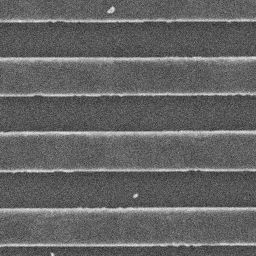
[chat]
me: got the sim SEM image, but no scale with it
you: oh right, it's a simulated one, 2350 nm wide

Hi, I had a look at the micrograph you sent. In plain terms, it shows lines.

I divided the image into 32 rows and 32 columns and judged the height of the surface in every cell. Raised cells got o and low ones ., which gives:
oooooooooooooooooooooooooooooooo
oooooooooooooooooooooooooooooooo
oooooooooooooooooooooooooooooooo
................................
................................
................................
................................
oooooooooooooooooooooooooooooooo
oooooooooooooooooooooooooooooooo
oooooooooooooooooooooooooooooooo
oooooooooooooooooooooooooooooooo
oooooooooooooooooooooooooooooooo
................................
................................
................................
................................
...........................ooo..
oooooooooooooooooooooooooooooooo
oooooooooooooooooooooooooooooooo
oooooooooooooooooooooooooooooooo
oooooooooooooooooooooooooooooooo
................................
................................
................................
................................
................................
oooooooooooooooooooooooooooooooo
oooooooooooooooooooooooooooooooo
oooooooooooooooooooooooooooooooo
oooooooooooooooooooooooooooooooo
oooooooooooooooooooooooooooooooo
................................